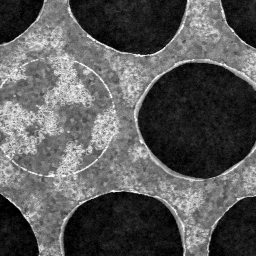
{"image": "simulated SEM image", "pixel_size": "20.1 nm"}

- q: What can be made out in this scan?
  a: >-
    holes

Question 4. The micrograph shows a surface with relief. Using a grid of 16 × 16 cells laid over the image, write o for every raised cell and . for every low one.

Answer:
...o........oo..
..ooo......ooo..
.ooooo.....oooo.
oooooooooooooooo
oooooooooo.....o
ooooooooo.......
ooooooooo.......
ooooooooo.......
ooooooooo.......
ooooooooo.......
oooooooooo....oo
oooooooooooooooo
.ooooo....ooooo.
.ooo.......ooo..
..oo.......oo...
..oo.......oo...